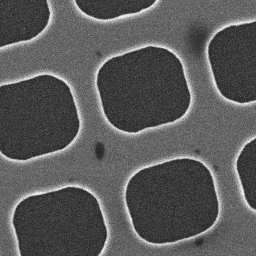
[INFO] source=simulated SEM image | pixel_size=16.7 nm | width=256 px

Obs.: holes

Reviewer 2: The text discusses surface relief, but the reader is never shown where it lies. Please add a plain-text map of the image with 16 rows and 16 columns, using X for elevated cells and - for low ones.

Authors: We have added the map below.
---XX----XXXXXXX
---XXXXXXXXXXXX-
--XXXXXXXXXXX---
XXXXXXX----XX---
XXXXXX-----XX---
----XX------XX--
-----X------XXXX
-----XX----XXXXX
-----XXXXXXXXXXX
---XXXXXXXXXXXX-
XXXXXXXXX----XX-
XXXXXXXX-----XX-
X-----XX------X-
X-----XX------XX
X------XX----XXX
X-----XXXXXXXXXX